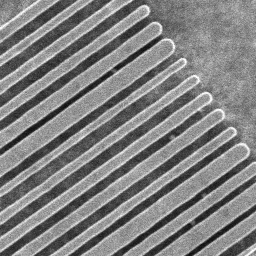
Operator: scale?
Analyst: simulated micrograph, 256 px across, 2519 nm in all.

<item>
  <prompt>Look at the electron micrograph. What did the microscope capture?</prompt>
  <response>groups of lines, slits or small figures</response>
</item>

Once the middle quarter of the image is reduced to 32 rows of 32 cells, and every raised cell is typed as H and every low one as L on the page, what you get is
HHHLLLLHHHHHHLLHHHHHHHHLLLLHHHLL
HHLLLLHHHHHLLLHHHHHHHLLLLHHHHLLL
LLLLHHHHHHLLLHHHHHHHLLLLHHHLLLLL
LLLHHHHHHLLHHHHHHHHLLLHHHHLLLLLH
LHHHHHHLLLHHHHHHHLLLLHHHHLLLLLHH
HHHHHHLLHHHHHHHHLLLHHHHLLLLLHHHH
HHHHLLLHHHHHHHLLLLHHHHLLLLLHHHHL
HHHLLLHHHHHHHLLLLHHHLLLLLLHHHHLL
HHLLHHHHHHHLLLLLHHHLLLLLHHHHLLLL
LLLHHHHHHHLLLLHHHLLLLLLHHHHLLLLL
LHHHHHHHHLLLLHHHLLLLLLHHHLLLLLHH
HHHHHHHLLLLHHHLLLLLLHHHHLLLLHHHH
HHHHHHLLLLHHHLLLLLLHHHHLLLLHHHHH
HHHHHLLLLHHHLLLLLHHHHHLLLLHHHHHL
HHHLLLLHHHLLLLLLHHHHLLLLLHHHHHLL
HHLLLLHHHLLLLLHHHHHLLLLHHHHHLLLL
HLLLLHHHLLLLLHHHHLLLLLHHHHHLLLLH
LLLHHHLLLLLLHHHHLLLLHHHHHLLLLHHH
LHHHHLLLLLHHHHLLLLLHHHHHLLLLHHHH
HHHHLLLLLHHHHLLLLLHHHHHLLLLHHHHH
HHLLLLLHHHHLLLLLHHHHHLLLLHHHHHHL
LLLLLLHHHHLLLLLHHHHHLLLLHHHHHLLL
LLLLLHHHHLLLLLHHHHLLLLHHHHHHLLLL
LLLHHHHLLLLLHHHHHLLLLHHHHHLLLLLH
LLHHHHLLLLLHHHHHLLLHHHHHHLLLLHHH
HHHHLLLLLHHHHHLLLLHHHHHHLLLLHHHH
HHHLLLLLHHHHHLLLLHHHHHLLLLLHHHHL
HHLLLLHHHHHLLLLLHHHHHLLLLHHHHLLL
LLLLLHHHHHLLLLHHHHHLLLLLHHHHLLLH
LLLLHHHHLLLLLHHHHHLLLLHHHHLLLLHH
LLHHHHHLLLLHHHHHHLLLLHHHHLLLLHHH
LHHHHHLLLLHHHHHLLLLLHHHHLLLHHHHH